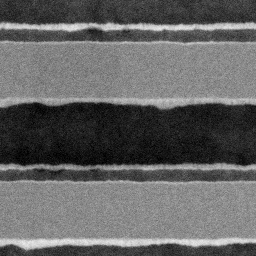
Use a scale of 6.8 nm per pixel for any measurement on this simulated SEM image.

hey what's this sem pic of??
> lines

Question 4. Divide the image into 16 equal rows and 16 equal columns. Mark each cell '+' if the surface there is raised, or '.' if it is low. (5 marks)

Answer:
................
................
++++++++++++++++
++++++++++++++++
++++++++++++++++
++++++++++++++++
................
................
................
................
..++............
++++++++++++++++
++++++++++++++++
++++++++++++++++
++++++++++++++++
................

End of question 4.